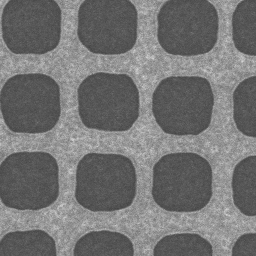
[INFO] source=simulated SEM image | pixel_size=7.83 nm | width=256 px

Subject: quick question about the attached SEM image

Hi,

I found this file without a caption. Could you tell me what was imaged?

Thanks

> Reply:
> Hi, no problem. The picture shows holes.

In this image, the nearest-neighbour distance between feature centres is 594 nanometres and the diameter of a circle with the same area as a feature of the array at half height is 496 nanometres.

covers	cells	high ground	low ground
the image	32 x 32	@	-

@------@@@-------@@@-------@@@--
--------@@-------@@@-------@@---
--------@@-------@@@-------@@---
--------@@-------@@@-------@@---
--------@@-------@@@-------@@---
@------@@@-------@@@-------@@---
@-----@@@@@-----@@@@@-----@@@@--
@@@@@@@@@@@@@@@@@@@@@@@@@@@@@@@@
@@@@@@@@@@@@@@@@@@@@@@@@@@@@@@@@
@@----@@@@@-----@@@@@@@@-@@@@@@@
@------@@@-------@@@------@@@@--
-------@@@-------@@--------@@---
--------@@-------@@--------@@---
--------@@-------@@--------@@---
--------@@-------@@-------@@@---
@------@@@-------@@@------@@@---
@@----@@@@@@@@-@@@@@@----@@@@@--
@@@@@@@@@@@@@@@@@@@@@@@@@@@@@@@@
@@@@@@@@@@@@@@@@@@@@@@@@@@@@@@@@
@------@@@@-----@@@@-----@@@@@@-
-------@@@-------@@-------@@@@--
-------@@--------@@-------@@@---
-------@@--------@@--------@@---
-------@@--------@@--------@@---
-------@@--------@@-------@@@---
-------@@@------@@@@------@@@---
@@@@@@@@@@@@--@@@@@@@@--@@@@@@--
@@@@@@@@@@@@@@@@@@@@@@@@@@@@@@@@
@@@@@@@@@@@@@@@@@@@@@@@@@@@@@@@@
------@@@@------@@@@@----@@@@@--
-------@@--------@@@------@@@---
-------@@--------@@--------@@---